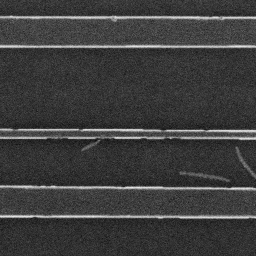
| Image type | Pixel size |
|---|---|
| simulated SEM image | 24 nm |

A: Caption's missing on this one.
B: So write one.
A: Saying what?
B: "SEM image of lines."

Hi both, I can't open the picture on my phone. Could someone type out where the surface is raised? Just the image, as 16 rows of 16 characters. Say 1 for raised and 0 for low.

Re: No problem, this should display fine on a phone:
0000000000000000
1111111111111111
1111111111111111
0000000000000000
0000000000000000
0000000000000000
0000000000000000
0000000000000000
0000000000000000
0000000000000000
0000000000000000
0000000000000000
1111111111111111
1111111111111111
0000000000000000
0000000000000000